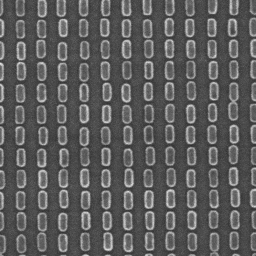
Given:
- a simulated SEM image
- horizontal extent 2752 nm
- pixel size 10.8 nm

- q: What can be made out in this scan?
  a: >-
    a regular array of raised bodies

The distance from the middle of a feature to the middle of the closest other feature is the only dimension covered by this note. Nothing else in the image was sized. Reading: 221 nm